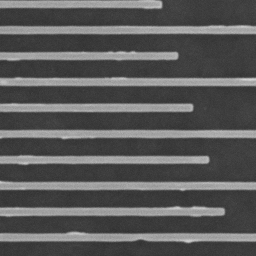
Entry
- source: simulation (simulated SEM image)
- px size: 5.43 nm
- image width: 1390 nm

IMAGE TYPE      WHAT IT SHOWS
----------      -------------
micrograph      parallel lines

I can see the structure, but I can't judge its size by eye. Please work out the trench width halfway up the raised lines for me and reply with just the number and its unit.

100 nanometers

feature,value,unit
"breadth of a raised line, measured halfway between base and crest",40.1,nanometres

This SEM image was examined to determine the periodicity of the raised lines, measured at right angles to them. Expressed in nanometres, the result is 141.